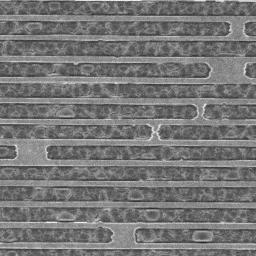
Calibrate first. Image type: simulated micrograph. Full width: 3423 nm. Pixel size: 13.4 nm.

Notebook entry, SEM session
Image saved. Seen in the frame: parallel lines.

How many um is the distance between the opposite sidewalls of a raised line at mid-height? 0.0702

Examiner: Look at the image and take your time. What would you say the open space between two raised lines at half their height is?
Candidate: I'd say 209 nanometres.